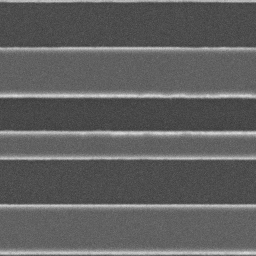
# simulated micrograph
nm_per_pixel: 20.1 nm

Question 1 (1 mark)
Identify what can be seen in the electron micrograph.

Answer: lines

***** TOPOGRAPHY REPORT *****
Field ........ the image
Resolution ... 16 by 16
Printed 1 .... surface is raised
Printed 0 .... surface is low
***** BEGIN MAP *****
0000000000000000
0000000000000000
0000000000000000
1111111111111111
1111111111111111
1111111111111111
0000000000000000
0000000000000000
1111111111111111
1111111111111111
0000000000000000
0000000000000000
0000000000000000
1111111111111111
1111111111111111
1111111111111111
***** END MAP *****